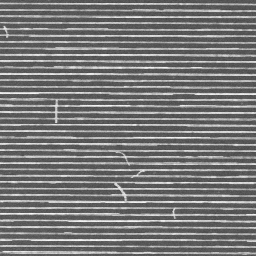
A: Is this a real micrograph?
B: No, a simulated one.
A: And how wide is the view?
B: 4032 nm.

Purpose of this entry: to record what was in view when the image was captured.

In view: parallel lines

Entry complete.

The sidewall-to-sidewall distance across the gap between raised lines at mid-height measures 0.0807 micrometres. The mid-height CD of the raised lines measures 0.0217 µm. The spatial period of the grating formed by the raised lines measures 0.101 microns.